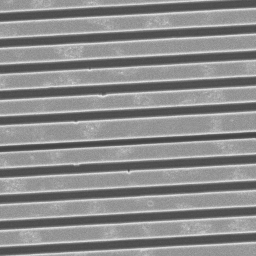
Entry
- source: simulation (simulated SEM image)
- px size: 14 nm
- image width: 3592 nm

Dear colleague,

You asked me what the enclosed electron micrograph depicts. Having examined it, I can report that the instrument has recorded parallel lines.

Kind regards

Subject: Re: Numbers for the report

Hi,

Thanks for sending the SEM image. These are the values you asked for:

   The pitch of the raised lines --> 364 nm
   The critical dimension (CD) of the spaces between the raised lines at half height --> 119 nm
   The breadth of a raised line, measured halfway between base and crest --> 17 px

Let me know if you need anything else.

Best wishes